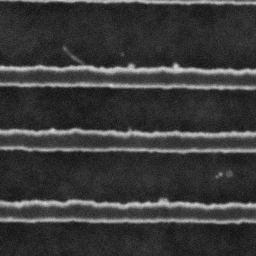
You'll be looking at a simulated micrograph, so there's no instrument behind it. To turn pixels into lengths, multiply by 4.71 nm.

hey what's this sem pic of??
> lines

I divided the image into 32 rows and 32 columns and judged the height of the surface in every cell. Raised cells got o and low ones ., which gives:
................................
................................
................................
................................
................................
................................
................................
................................
ooooooo.oooo........o...........
oooooooooooooooooooooooooooooooo
oooooooooooooooooooooooooooooooo
................................
................................
................................
................................
................................
ooooooooooooooo.o....o..........
oooooooooooooooooooooooooooooooo
oooooooooooooooooooooooooooooooo
................................
................................
................................
................................
................................
................................
ooooooooooooooo.oooooooo.....o..
oooooooooooooooooooooooooooooooo
oooooooooooooooooooooooooooooooo
................................
................................
................................
................................